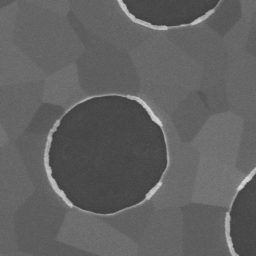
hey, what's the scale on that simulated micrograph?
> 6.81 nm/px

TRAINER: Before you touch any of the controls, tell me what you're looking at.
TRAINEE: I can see holes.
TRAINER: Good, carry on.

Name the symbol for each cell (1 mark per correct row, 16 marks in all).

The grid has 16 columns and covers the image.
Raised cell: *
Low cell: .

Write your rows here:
********.....***
*********...****
****************
****************
****************
****************
*****....*******
****......******
***.......******
***.......******
***.......******
****......*****.
****.....******.
**************..
**************..
***************.